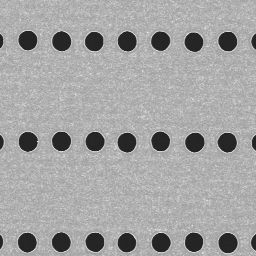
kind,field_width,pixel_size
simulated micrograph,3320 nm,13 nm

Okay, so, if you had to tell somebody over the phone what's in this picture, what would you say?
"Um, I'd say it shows a regular array of holes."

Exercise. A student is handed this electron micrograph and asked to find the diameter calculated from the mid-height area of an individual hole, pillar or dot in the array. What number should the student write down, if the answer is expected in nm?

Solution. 249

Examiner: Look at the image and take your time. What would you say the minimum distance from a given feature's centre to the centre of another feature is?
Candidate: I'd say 428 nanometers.